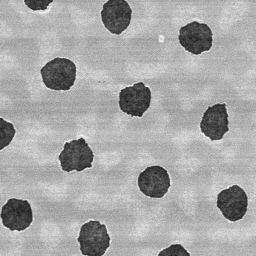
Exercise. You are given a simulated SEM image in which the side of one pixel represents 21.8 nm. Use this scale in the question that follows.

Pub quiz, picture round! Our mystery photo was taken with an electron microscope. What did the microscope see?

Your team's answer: holes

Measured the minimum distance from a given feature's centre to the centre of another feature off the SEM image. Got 1780 nm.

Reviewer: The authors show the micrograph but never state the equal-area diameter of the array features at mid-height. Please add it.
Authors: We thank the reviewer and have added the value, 736 nm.